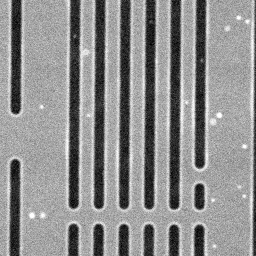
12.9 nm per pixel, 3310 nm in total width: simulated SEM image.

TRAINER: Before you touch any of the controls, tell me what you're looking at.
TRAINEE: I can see groups of lines, slits or small figures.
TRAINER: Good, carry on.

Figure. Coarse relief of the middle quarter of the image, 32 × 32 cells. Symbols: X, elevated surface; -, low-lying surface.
X---XXX---XXXX---XXX---XXX---XXX
X---XXX---XXXX---XXX---XXX---XXX
X---XXX---XXXX---XXX---XXX---XXX
X---XXX---XXXX---XXX---XXX---XXX
X---XXX---XXXX---XXX---XXX---XXX
X---XXX---XXXX---XXX---XXX---XXX
X---XXX---XXXX---XXX---XXX---XXX
X---XXX---XXXX---XXX---XXX---XXX
X---XXX---XXXX---XXX---XXX---XXX
X---XXX---XXXX---XXX---XXX---XXX
X---XXX---XXXX---XXX---XXX---XXX
X---XXX---XXXX---XXX---XXX---XXX
X---XXX---XXXX---XXX---XXX---XXX
X---XXX---XXXX---XXX---XXX---XXX
X---XXX---XXXX---XXX---XXX---XXX
X---XXX---XXXX---XXX---XXX---XXX
X---XXX---XXXX---XXX---XXX---XXX
X---XXX---XXXX---XXX---XXX---XXX
X---XXX---XXXX---XXX---XXX---XXX
X---XXX---XXXX---XXX---XXX---XXX
X---XXX---XXXX---XXX---XXX---XXX
X---XXX---XXXX---XXX---XXX---XXX
X---XXX---XXXX---XXX---XXX---XXX
X---XXX---XXXX---XXX---XXX---XXX
X---XXX---XXXX---XXX---XXX---XXX
X---XXX---XXXX---XXX---XXX---XXX
X---XXX---XXXX---XXX---XXX---XXX
X---XXX---XXXX---XXX---XXX---XXX
X---XXX---XXXX---XXX---XXX---XXX
X---XXX---XXXX---XXX---XXX---XXX
X---XXX---XXXX---XXX---XXX---XXX
X---XXX---XXXX---XXX---XXX---XXX